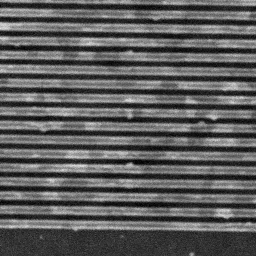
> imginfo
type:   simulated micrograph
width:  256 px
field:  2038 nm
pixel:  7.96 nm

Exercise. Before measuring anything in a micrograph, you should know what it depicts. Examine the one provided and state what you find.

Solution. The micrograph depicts parallel lines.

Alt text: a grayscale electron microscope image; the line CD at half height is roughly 47.8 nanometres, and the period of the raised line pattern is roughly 112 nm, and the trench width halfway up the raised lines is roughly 62.7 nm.